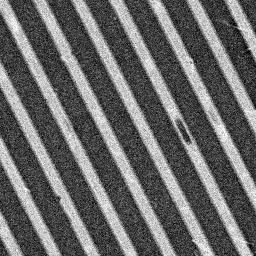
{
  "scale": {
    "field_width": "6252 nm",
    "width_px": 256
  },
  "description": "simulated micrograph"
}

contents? parallel lines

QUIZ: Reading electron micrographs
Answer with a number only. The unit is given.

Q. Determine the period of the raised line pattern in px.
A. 34.1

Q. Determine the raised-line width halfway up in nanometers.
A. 253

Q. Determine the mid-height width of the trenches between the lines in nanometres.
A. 587